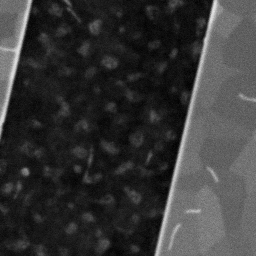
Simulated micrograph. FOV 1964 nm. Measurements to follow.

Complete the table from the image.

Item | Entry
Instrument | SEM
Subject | one or a few lines or trenches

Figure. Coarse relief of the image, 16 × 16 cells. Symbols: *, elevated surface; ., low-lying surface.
**...........***
**...........***
*............***
*............***
*...........****
*...........****
............****
............****
............****
...........*****
...........*****
...........*****
...........*****
..........******
..........******
..........******